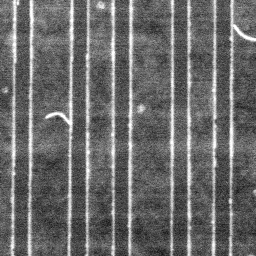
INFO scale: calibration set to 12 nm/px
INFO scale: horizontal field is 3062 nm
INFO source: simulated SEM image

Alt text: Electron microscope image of lines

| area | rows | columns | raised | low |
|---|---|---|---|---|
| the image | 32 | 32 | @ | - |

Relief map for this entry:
@@--@@@@@--@@@--@@@@@@--@@@--@@@
@@--@@@@@--@@@--@@@@@@--@@@--@@@
@@--@@@@@--@@@--@@@@@@--@@@--@@@
@@--@@@@@--@@@--@@@@@@--@@@--@@@
@@--@@@@@--@@@--@@@@@@--@@@--@@@
@@--@@@@@--@@@--@@@@@@--@@@--@@@
@@--@@@@@--@@@--@@@@@@--@@@--@@@
@@--@@@@@--@@@--@@@@@@--@@@--@@@
@@--@@@@@--@@@--@@@@@@--@@@--@@@
@@--@@@@@--@@@--@@@@@@--@@@--@@@
@@--@@@@@--@@@--@@@@@@--@@@--@@@
@@--@@@@@--@@@--@@@@@@--@@@--@@@
@@--@@@@@--@@@--@@@@@@--@@@--@@@
@@--@@@@@--@@@--@@@@@@--@@@--@@@
@@--@@@@@--@@@--@@@@@@--@@@--@@@
@@--@@@@@--@@@--@@@@@@--@@@--@@@
@@--@@@@@--@@@--@@@@@@--@@@--@@@
@@--@@@@@--@@@--@@@@@---@@@--@@@
@@--@@@@@--@@@--@@@@@---@@@--@@@
@@--@@@@@--@@@--@@@@@---@@@--@@@
@@--@@@@@--@@@--@@@@@---@@@--@@@
@@--@@@@@--@@@--@@@@@---@@@--@@@
@@--@@@@@--@@@--@@@@@---@@@--@@@
@@--@@@@@--@@@--@@@@@---@@@--@@@
@@--@@@@@--@@@--@@@@@---@@@--@@@
@@--@@@@@--@@@--@@@@@---@@@--@@@
@@--@@@@@--@@@--@@@@@---@@@--@@@
@@--@@@@@--@@@--@@@@@---@@@--@@@
@@--@@@@@--@@@--@@@@@---@@@--@@@
@@--@@@@@--@@@--@@@@@---@@@--@@@
@@--@@@@@--@@@--@@@@@---@@@--@@@
@@--@@@@@--@@@--@@@@@---@@@--@@@